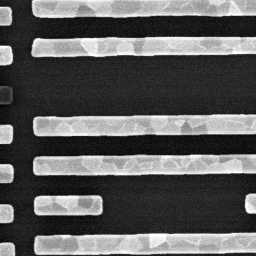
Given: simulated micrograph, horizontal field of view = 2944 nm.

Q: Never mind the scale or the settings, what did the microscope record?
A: wiring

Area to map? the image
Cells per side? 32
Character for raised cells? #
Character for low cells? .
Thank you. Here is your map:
....############################
#...############################
#...............................
................................
................................
....############################
#...############################
#...............................
................................
................................
................................
#...............................
#...............................
................................
......................##########
....############################
##..############################
#...............................
................................
...............#################
....############################
##..############################
#...............................
................................
...............................#
....#########..................#
##..#########..................#
#...............................
................................
...........#####################
#...############################
##...#########################..